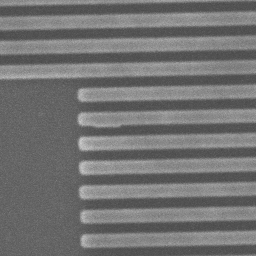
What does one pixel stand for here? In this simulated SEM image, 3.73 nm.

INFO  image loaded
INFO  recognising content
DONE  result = parallel lines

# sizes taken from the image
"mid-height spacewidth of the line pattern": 43.4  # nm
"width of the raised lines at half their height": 49.9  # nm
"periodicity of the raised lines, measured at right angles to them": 90.9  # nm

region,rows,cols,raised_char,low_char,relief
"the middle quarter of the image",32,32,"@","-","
@@@@@@@@@@@@@@@@@@@@@@@@@@@@@@@@
@@@@@@@@@@@@@@@@@@@@@@@@@@@@@@@@
@@@@@@@@@@@@@@@@@@@@@@@@@@@@@@@@
--------------------------------
--------------------------------
--------------------------------
----@@@@@@@@@@@@@@@@@@@@@@@@@@@@
----@@@@@@@@@@@@@@@@@@@@@@@@@@@@
----@@@@@@@@@@@@@@@@@@@@@@@@@@@@
--------------------------------
--------------------------------
--------------------------------
----@@@@@@@@@@@@@@@@@@@@@@@@@@@@
----@@@@@@@@@@@@@@@@@@@@@@@@@@@@
----@@@@@@@@@@@@@@@@@@@@@@@@@@@@
-------@@@@@@@------------------
--------------------------------
--------------------------------
------@@@@@@@@@@@@@@@@@@@@@@@@@@
----@@@@@@@@@@@@@@@@@@@@@@@@@@@@
----@@@@@@@@@@@@@@@@@@@@@@@@@@@@
--------------------------------
--------------------------------
--------------------------------
---------@@@@@@@@@@@@@@@@@@@@@@@
----@@@@@@@@@@@@@@@@@@@@@@@@@@@@
----@@@@@@@@@@@@@@@@@@@@@@@@@@@@
--------------------------------
--------------------------------
--------------------------------
------------@@@@@@@@@@@@@@@@@@@@
----@@@@@@@@@@@@@@@@@@@@@@@@@@@@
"